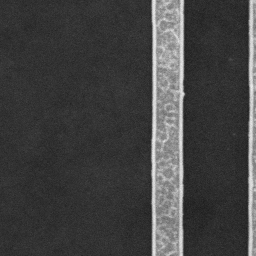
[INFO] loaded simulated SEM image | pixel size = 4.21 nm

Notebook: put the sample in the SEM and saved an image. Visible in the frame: one or a few lines or trenches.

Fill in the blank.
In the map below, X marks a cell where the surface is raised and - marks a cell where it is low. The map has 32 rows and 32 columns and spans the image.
-------------------XXXX--------X
-------------------XXXX--------X
-------------------XXXX--------X
-------------------XXXX--------X
-------------------XXXX--------X
-------------------XXXX--------X
-------------------XXXX--------X
-------------------XXXX--------X
-------------------XXXX--------X
-------------------XXXX--------X
-------------------XXXX--------X
-------------------XXXX--------X
-------------------XXXX--------X
-------------------XXXX--------X
-------------------XXXX--------X
-------------------XXXX--------X
-------------------XXXX--------X
-------------------XXXX--------X
-------------------XXXX--------X
-------------------XXXX--------X
-------------------XXXX--------X
-------------------XXXX--------X
-------------------XXXX--------X
-------------------XXXX--------X
-------------------XXXX--------X
-------------------XXXX--------X
-------------------XXXX--------X
-------------------XXXX--------X
-------------------XXXX--------X
-------------------XXXX--------X
-------------------XXXX--------X
-------------------XXXX--------X